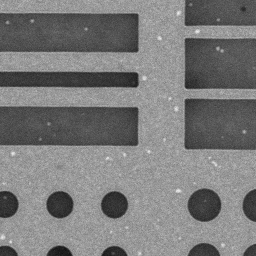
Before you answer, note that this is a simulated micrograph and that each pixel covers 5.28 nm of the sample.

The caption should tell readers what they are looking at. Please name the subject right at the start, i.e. groups of lines, slits or small figures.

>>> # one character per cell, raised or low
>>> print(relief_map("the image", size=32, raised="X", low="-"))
XXXXXXXXXXXXXXXXXXXXXXX---------
-XXX--XXXXXXXXXXXXXXXXX---------
-----------------XXXXXX---------
-----------------XXXXXXXXXXXXXXX
-----------------XXXXXXXXXXXXXXX
-----------------XXXXXX---------
-----------------XXXXXX---------
XXXXXXXXXXXXXXXXXXXXXXX---------
XXXXXXXXXXXXXXXXXXXXXXX---------
-----------------XXXXXX---------
-----------------XXXXXX---------
XXXXXXXXXXXXXXXXXXXXXXXXXXXXXXXX
XXXXXXXXXXXXXXXXXXXXXXX---------
-----------------XXXXXX---------
-----------------XXXXXX---------
-----------------XXXXXX---------
-----------------XXXXXX---------
-----------------XXXXXX---------
XXXXXXXXXXXXXXXXXXXXXXX---------
XXXXXXXXXXXXXXXXXXXXXXXXXXXXXXXX
XXXXXXXXXXXXXXXXXXXXXXXXXXXXXXXX
XXXXXXXXXXXXXXXXXXXXXXXXXXXXXXXX
XXXXXXXXXXXXXXXXXXXXXXXXXXXXXXXX
XXXXXXXXXXXXXXXXXXXXXXXXXXXXXXXX
--XXXX---XXXX---XXXXXXXX---XXXX-
--XXXX---XXXX---XXXXXXXX----XX--
--XXXX---XXXX---XXXXXXXX----XX--
XXXXXXXXXXXXXXXXXXXXXXXX---XXXX-
XXXXXXXXXXXXXXXXXXXXXXXXXXXXXXXX
XXXXXXXXXXXXXXXXXXXXXXXXXXXXXXXX
XXXXXXXXXXXXXXXXXXXXXXXXX-XXXXXX
--XXXX---XXXX---XXXXXXXX---XXXX-